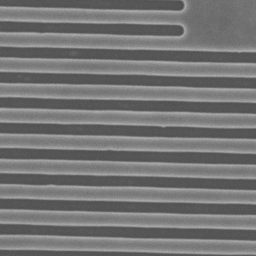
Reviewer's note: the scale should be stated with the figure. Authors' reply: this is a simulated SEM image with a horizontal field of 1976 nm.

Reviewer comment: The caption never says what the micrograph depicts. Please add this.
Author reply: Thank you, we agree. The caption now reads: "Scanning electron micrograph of parallel lines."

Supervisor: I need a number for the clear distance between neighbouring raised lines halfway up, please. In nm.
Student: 84.9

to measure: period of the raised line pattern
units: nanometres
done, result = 196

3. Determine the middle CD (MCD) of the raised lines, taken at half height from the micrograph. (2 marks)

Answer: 106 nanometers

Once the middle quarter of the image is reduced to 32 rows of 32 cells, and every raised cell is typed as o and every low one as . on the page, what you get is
oooooooooooooooooooooooooooooooo
oooooooooooooooooooooooooooooooo
................oooooooooooooooo
................................
................................
ooooooooooooooooo...............
oooooooooooooooooooooooooooooooo
oooooooooooooooooooooooooooooooo
oooooooooooooooooooooooooooooooo
................................
................................
................................
oooooooooooooooooooooooooooooooo
oooooooooooooooooooooooooooooooo
oooooooooooooooooooooooooooooooo
........................ooo...oo
................................
................................
oooooooooooooooooooooooooo......
oooooooooooooooooooooooooooooooo
oooooooooooooooooooooooooooooooo
.......oooo......ooooooooooooooo
................................
................................
ooooooooooooo...................
oooooooooooooooooooooooooooooooo
oooooooooooooooooooooooooooooooo
oooooooooooooooooooooooooooooooo
................................
................................
o...............................
oooooooooooooooooooooooooooooooo